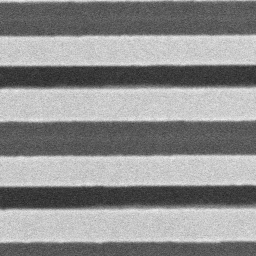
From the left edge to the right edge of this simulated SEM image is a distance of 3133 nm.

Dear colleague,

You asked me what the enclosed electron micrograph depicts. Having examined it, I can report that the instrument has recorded lines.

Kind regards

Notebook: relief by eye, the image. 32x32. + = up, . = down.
................................
................................
................................
................................
................................
++++++++++++++++++++++++++++++++
++++++++++++++++++++++++++++++++
++++++++++++++++++++++++++++++++
................................
................................
................................
++++++++++++++++++++++++++++++++
++++++++++++++++++++++++++++++++
++++++++++++++++++++++++++++++++
++++++++++++++++++++++++++++++++
................................
................................
................................
................................
................................
++++++++++++++++++++++++++++++++
++++++++++++++++++++++++++++++++
++++++++++++++++++++++++++++++++
................................
................................
................................
++++++++++++++++++++++++++++++++
++++++++++++++++++++++++++++++++
++++++++++++++++++++++++++++++++
++++++++++++++++++++++++++++++++
................................
................................